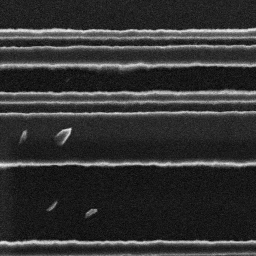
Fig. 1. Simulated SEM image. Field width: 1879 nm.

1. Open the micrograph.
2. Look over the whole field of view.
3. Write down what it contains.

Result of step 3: lines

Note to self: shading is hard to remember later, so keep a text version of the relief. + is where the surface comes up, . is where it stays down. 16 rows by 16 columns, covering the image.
................
................
++++++++++++++++
++++++++++++++++
................
................
++++++++++++++++
++++++++++++++++
++++++++++++++++
++++++++++++++++
................
................
................
................
................
++++++++++++++++